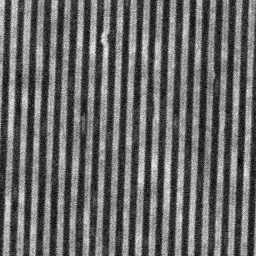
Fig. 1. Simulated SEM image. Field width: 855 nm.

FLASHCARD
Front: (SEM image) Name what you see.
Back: parallel lines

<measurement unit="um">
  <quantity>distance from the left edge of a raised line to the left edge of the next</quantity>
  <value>0.0441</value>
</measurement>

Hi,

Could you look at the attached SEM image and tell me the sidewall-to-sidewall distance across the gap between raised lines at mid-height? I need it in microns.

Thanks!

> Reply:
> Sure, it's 0.0276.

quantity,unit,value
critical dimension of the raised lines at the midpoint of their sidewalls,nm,18.4